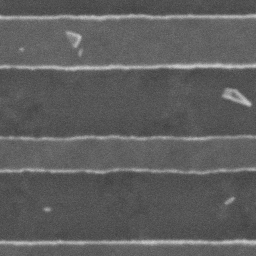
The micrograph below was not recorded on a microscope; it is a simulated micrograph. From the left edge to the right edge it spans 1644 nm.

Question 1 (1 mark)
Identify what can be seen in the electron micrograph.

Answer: lines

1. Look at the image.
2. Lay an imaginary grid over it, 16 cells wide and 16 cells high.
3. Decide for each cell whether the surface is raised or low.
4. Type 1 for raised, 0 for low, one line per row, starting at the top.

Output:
0000000000000000
1111111111111111
1111111111111111
1111111111111111
0000000000000000
0000000000000000
0000000000000000
0000000000000000
0000000000000000
1111111111111111
1111111111111111
0000000000000000
0000000000000000
0000000000000000
0000000000000000
1111111111111111